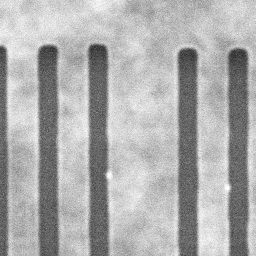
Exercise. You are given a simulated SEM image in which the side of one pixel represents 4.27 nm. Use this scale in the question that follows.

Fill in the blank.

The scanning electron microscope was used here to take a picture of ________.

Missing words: groups of lines, slits or small figures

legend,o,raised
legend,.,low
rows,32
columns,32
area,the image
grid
oooooooooooooooooooooooooooooooo
oooooooooooooooooooooooooooooooo
oooooooooooooooooooooooooooooooo
oooooooooooooooooooooooooooooooo
oooooooooooooooooooooooooooooooo
oooooooooooooooooooooooooooooooo
.oooo..oooo...oooooooo...oooo..o
.oooo..oooo...oooooooo...ooo...o
.oooo..oooo...oooooooo...ooo...o
.oooo..oooo...oooooooo...ooo...o
.oooo..oooo...oooooooo...ooo...o
.oooo..oooo...oooooooo...ooo...o
.oooo..oooo...oooooooo...ooo...o
.oooo..oooo...oooooooo...ooo...o
.oooo..oooo...oooooooo...ooo...o
.oooo..oooo...oooooooo...ooo...o
.oooo..oooo...oooooooo...ooo...o
.oooo..oooo...oooooooo...ooo...o
.oooo..oooo...oooooooo...ooo...o
.oooo..oooo...oooooooo...ooo...o
.oooo..oooo...oooooooo...ooo...o
.oooo..oooo...oooooooo...ooo...o
.oooo..oooo...oooooooo...ooo...o
.oooo..oooo...oooooooo...oooo..o
.oooo..oooo...oooooooo...ooo...o
.oooo..oooo...oooooooo...ooo...o
.oooo..oooo...oooooooo...ooo...o
.oooo..oooo...oooooooo...ooo...o
.oooo...ooo...oooooooo...ooo...o
.oooo...ooo...oooooooo...ooo...o
.oooo...ooo...oooooooo...ooo...o
.oooo..oooo...oooooooo...ooo...o